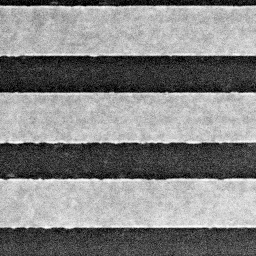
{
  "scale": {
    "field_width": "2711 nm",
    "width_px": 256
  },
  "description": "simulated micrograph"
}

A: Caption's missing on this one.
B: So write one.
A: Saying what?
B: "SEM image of lines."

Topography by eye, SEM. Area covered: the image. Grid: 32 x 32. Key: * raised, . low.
................................
********************************
********************************
********************************
********************************
********************************
********************************
................................
................................
................................
................................
................................
********************************
********************************
********************************
********************************
********************************
********************************
................................
................................
................................
................................
****.*************.********.****
********************************
********************************
********************************
********************************
********************************
................................
................................
................................
................................